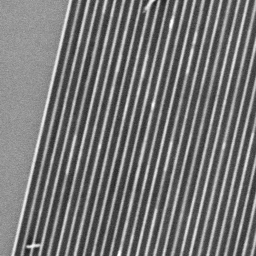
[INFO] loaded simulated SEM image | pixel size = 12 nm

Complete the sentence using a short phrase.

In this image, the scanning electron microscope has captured parallel lines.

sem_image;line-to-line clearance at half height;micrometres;0.0851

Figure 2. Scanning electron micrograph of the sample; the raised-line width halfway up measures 1.83 pixels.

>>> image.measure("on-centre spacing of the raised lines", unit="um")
0.104